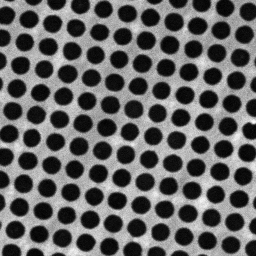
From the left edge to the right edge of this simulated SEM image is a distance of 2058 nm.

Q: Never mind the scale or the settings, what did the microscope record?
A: a regular array of holes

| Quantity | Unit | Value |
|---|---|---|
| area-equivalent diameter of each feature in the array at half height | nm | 153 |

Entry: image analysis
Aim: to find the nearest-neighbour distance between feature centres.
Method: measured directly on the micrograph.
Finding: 0.186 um